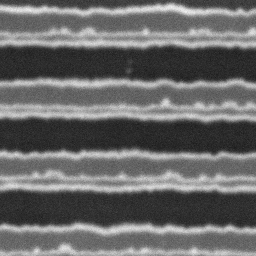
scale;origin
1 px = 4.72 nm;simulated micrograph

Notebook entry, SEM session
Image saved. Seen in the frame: lines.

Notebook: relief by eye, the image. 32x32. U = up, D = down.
DDDDDDDDDDDDDDDDDDDDDDDDDDDDDDDD
UUUUUUUUUUDUUUUUUUUUUUUUUUUUUUDU
UUUUUUUUUUUUUUUUUUUUUUUUUUUUUUUU
UUUUUUUUUUUUUUUUUUUUUUUUUUUUUUUU
UUUUUUUUUUUUUUUUUUUUUUUUUUUUUUUU
DDDDDDUDDDDDDDDDDUDDDDDUUDDDUDUU
DDDDDDDDDDDDDDDDDDDDDDDDDDDDDDDD
DDDDDDDDDDDDDDDDDDDDDDDDDDDDDDDD
DDDDDDDDDDDDDDDDDDDDDDDDDDDDDDDD
DDDDDDDDDDDDDDDDDDDDDDDDDDDDDDDD
UUUUUUUUUUUDUUUUUUDUUUDDUUUUUUUD
UUUUUUUUUUUUUUUUUUUUUUUUUUUUUUUU
UUUUUUUUUUUUUUUUUUUUUUUUUUUUUUUU
UUUUUUUUUUUUUUUUUUUUUUUUUUUUUUUU
DDDDDDDDDDUUDDDDDUUUUUUUUUUUUUUU
DDDDDDDDDDDDDDDDDDDDDDDDDDDDDDDD
DDDDDDDDDDDDDDDDDDDDDDDDDDDDDDDD
DDDDDDDDDDDDDDDDDDDDDDDDDDDDDDDD
DDDDDDDDDDDDDDDDDDDDDDDDDDDDDDDD
UUUUUUUUUUUUUUUUUUUDUUUUUUDUUUUU
UUUUUUUUUUUUUUUUUUUUUUUUUUUUUUUU
UUUUUUUUUUUUUUUUUUUUUUUUUUUUUUUU
UUUUUUUUUUUUUUUUUUUUUUUUUUUUUUUU
DDDDDDDDDDDDUUUUUUUDDDUUUUDUUUUU
DDDDDDDDDDDDDDDDDDDDDDDDDDDDDDDD
DDDDDDDDDDDDDDDDDDDDDDDDDDDDDDDD
DDDDDDDDDDDDDDDDDDDDDDDDDDDDDDDD
DDDDDDDDDDDDDDDDDDDDDDDDDDDDDDDD
UUDUDDDDDUUDDDDDDDDDDDDDDDDDDDDD
UUUUUUUUUUUUUUUUUUUUUUUUUUUUUUUU
UUUUUUUUUUUUUUUUUUUUUUUUUUUUUUUU
UUUUUUUUUUUUUUUUUUUUUUUUUUUUUUUU